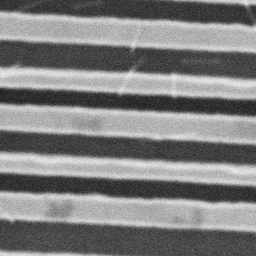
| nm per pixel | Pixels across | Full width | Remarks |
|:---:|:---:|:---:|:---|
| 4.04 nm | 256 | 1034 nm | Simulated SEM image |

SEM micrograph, lines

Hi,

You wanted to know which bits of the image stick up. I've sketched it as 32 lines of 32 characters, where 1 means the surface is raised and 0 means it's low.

00000000000000000000000000000011
00000000000000000000000000000000
11111111111111111100000000000000
11111111111111111111111111111111
11111111111111111111111111111111
00000000000001111111111111111111
00000000000000000000000000000001
00000000000000000000000000000000
00000000000000000000000000000000
11111111111111111111110000000000
11111111111111111111111111111111
00000000000001111111111111111111
00000000000000000000000000000000
11111111111000000000000000000000
11111111111111111111111111111000
11111111111111111111111111111111
00000111111111111111111111111111
00000000000000000000000011111111
00000000000000000000000000000000
11110000000000000000000000000000
11111111111111111111100000000000
01111111111111111111111111111111
00000000000000000000011111111111
00000000000000000000000000000000
11111111111110000000000000000000
11111111111111111111111111111111
11111111111111111111111111111111
01011111111111111111111111111111
00000000000000000000000001111111
00000000000000000000000000000000
00000000000000000000000000000000
00000000000000000000000000000000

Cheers